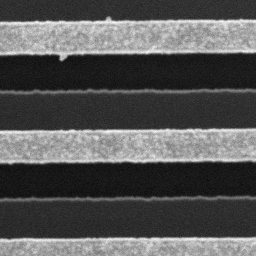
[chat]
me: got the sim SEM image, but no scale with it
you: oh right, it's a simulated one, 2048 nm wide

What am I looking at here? lines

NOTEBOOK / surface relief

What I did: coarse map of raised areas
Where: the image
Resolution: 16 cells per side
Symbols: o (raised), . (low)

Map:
oooooooooooooooo
oooooooooooooooo
oooooooooooooooo
................
................
................
oooooooooooooooo
oooooooooooooooo
oooooooooooooooo
oooooooooooooooo
................
................
oooooooooooooooo
oooooooooooooooo
oooooooooooooooo
oooooooooooooooo